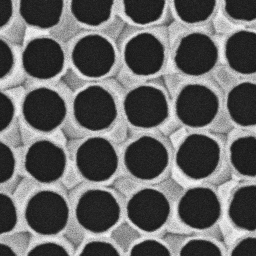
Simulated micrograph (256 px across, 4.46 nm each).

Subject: a regular array of holes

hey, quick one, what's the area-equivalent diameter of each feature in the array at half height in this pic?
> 190 nm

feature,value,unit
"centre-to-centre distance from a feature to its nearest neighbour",226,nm